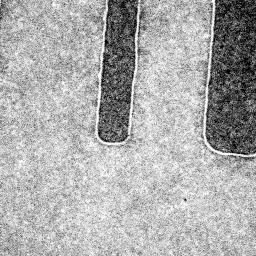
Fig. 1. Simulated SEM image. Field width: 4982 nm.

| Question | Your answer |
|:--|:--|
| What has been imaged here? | one or a few lines or trenches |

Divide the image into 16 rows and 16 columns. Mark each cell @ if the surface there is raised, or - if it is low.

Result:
-------@@----@@@
-------@@----@@@
------@@@----@@@
------@@@----@@@
------@@-----@@@
------@@-----@@@
------@@-----@@@
------@@-----@@@
------@@-----@@@
--------------@@
----------------
----------------
----------------
----------------
----------------
----------------